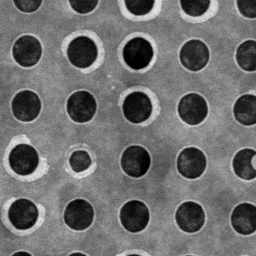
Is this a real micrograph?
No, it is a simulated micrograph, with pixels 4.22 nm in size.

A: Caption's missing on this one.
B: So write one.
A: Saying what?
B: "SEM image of a regular array of holes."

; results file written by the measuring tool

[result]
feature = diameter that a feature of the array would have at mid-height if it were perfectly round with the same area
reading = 32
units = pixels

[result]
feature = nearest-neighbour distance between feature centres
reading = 53.9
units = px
